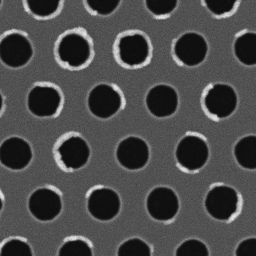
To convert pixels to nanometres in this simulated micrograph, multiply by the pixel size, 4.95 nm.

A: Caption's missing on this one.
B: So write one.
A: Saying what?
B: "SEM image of a regular array of holes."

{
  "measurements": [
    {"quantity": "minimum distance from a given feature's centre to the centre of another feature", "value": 290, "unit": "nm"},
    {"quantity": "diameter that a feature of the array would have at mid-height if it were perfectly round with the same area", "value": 156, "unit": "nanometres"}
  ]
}